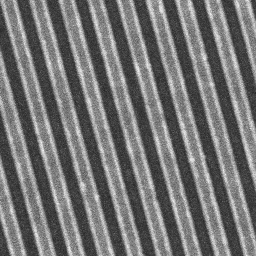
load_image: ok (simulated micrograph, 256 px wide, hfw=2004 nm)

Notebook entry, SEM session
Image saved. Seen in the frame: parallel lines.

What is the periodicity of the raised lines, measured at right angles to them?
221 nanometers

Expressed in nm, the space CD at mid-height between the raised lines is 114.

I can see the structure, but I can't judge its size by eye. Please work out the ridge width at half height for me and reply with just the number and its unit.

106 nm